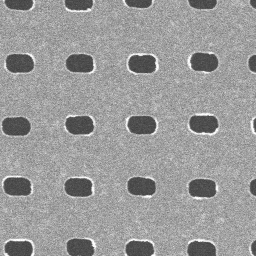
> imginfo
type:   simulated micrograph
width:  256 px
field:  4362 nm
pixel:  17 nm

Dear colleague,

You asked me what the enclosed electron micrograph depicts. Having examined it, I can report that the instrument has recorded a regular array of holes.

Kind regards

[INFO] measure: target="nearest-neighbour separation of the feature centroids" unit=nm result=1040